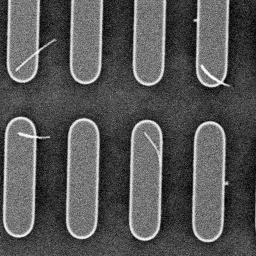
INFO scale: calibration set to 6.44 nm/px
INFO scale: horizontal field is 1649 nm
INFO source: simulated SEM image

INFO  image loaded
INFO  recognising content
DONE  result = groups of lines, slits or small figures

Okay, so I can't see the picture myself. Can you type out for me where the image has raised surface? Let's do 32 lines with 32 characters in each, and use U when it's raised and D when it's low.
DUUUUDDDDUUUUDDDDUUUUDDDDUUUUDDD
DUUUUDDDDUUUUDDDDUUUUDDDDUUUDDDD
DUUUUDDDDUUUUDDDDUUUUDDDDUUUDDDD
DUUUUDDDDUUUUDDDDUUUUDDDDUUUDDDD
DUUUUDDDDUUUUDDDDUUUUDDDDUUUDDDD
DUUUUDDDDUUUUDDDDUUUDDDDDUUUDDDD
DUUUUDDDDUUUUDDDDUUUDDDDDUUUDDDD
DUUUUDDDDUUUUDDDDUUUDDDDDUUUDDDD
DUUUUDDDDUUUUDDDDUUUDDDDDUUUDDDD
DUUUDDDDDUUUDDDDDUUUDDDDDUUUDDDD
DDDDDDDDDDDDDDDDDDUDDDDDDUUUDDDD
DDDDDDDDDDDDDDDDDDDDDDDDDDDDDDDD
DDDDDDDDDDDDDDDDDDDDDDDDDDDDDDDD
DDDDDDDDDDDDDDDDDDDDDDDDDDDDDDDD
DDDDDDDDDDDDDDDDDDDDDDDDDDDDDDDD
DUUUDDDDDUUUDDDDDUUDDDDDDUUDDDDD
DUUUDDDDDUUUDDDDDUUUDDDDDUUUDDDD
DUUUUDDDDUUUDDDDUUUUDDDDUUUUDDDD
DUUUDDDDDUUUDDDDUUUUDDDDUUUUDDDD
DUUUDDDDDUUUDDDDUUUUDDDDUUUUDDDD
DUUUDDDDDUUUDDDDUUUUDDDDUUUUDDDD
DUUUDDDDUUUUDDDDUUUUDDDDUUUUDDDD
DUUUDDDDUUUUDDDDUUUUDDDDUUUUDDDD
DUUUDDDDUUUUDDDDUUUUDDDDUUUUDDDD
DUUUDDDDUUUUDDDDUUUUDDDDUUUUDDDD
UUUUDDDDUUUUDDDDUUUUDDDDUUUUDDDD
UUUUDDDDUUUUDDDDUUUUDDDDUUUUDDDD
UUUUDDDDUUUUDDDDUUUUDDDDUUUUDDDD
DUUUDDDDUUUUDDDDUUUUDDDDUUUUDDDD
DDUDDDDDDUUDDDDDDUUDDDDDDUUDDDDD
DDDDDDDDDDDDDDDDDDDDDDDDDDDDDDDD
DDDDDDDDDDDDDDDDDDDDDDDDDDDDDDDD